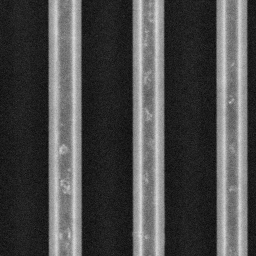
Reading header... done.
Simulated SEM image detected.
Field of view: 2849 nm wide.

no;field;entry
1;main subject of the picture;one or a few lines or trenches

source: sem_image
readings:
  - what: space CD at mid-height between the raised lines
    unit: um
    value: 0.683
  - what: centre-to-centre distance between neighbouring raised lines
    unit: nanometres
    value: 928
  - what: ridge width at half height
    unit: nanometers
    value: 244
